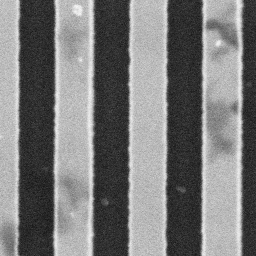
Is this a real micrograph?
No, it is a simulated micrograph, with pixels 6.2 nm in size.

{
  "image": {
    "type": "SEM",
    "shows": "lines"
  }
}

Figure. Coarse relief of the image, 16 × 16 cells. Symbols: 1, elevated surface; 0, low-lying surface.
1001110011000110
1001110011000110
1001110011000110
1001110011000110
1001110011000110
1001110011000110
1001110011000110
1001110011000110
1001110011000110
1001110011000110
1001110011000110
1001110011000110
1001110011000110
1001110011000110
1001110011000110
1001110011000110